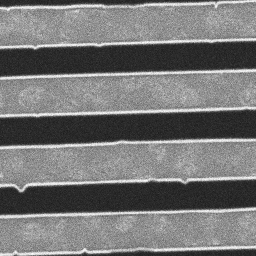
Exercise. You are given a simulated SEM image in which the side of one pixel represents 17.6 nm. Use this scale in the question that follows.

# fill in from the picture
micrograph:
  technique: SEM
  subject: one or a few lines or trenches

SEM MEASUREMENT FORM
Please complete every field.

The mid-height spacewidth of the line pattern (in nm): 660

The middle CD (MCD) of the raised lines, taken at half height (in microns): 0.561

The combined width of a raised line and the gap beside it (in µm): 1.22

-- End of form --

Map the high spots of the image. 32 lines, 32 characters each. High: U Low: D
UUUUUUUUUUUUUUUUUUUUUUDUUDDDDDDD
DDDDDDDDDDDDDDDDDDDDDDDDDDDDDDDD
DDDDDDDDDDDDDDDDDDDDDDDDDDDDDDDD
DDDDDDDDDDDDDDDDDDDDDDDDDDDDDDDD
DDDDDDDDDDDDDDDDDDDDDDDDDDDDDDDD
DDDDDDDDDDDDDDDUUUUUUUUUUUUUUUUU
UUUUUUUUUUUUUUUUUUUUUUUUUUUUUUUU
UUUUUUUUUUUUUUUUUUUUUUUUUUUUUUUU
UUUUUUUUUUUUUUUUUUUUUUUUUUUUUUUU
UUUUUUUDDDDDDDDDDDDDDDDDDDDDDDDD
DDDDDDDDDDDDDDDDDDDDDDDDDDDDDDDD
DDDDDDDDDDDDDDDDDDDDDDDDDDDDDDDD
DDDDDDDDDDDDDDDDDDDDDDDDDDDDDDDD
DDDDDDDDDDDDDDDDDDDDDDDDDDDDDDUD
UUUUUUUUUUUUUUUUUUUUUUUUUUUUUUUU
UUUUUUUUUUUUUUUUUUUUUUUUUUUUUUUU
UUUUUUUUUUUUUUUUUUUUUUUUUUUUUUUU
UUUUUUUUUUUUUUUUUUUUUUUUUUUUUDUU
UDDDDDDDDDDDDDDDDDDDDDDDDDDDDDDD
DDDDDDDDDDDDDDDDDDDDDDDDDDDDDDDD
DDDDDDDDDDDDDDDDDDDDDDDDDDDDDDDD
DDDDDDDDDDDDDDDDDDDDDDDDDDDDDDDD
DDDDDDDDDDDDDDDDDDDUDDDDUUUUUUUU
UUDUUUUUUUUUUUUUUUUUUUUUUUUUUUUU
UUUUUUUUUUUUUUUUUUUUUUUUUUUUUUUU
UUUUUUUUUUUUUUUUUUUUUUUUUUUUUUUU
UUUUUUUUUUUUUUUUUUUDUUDDDDDDDDDD
DDDDDDDDDDDDDDDDDDDDDDDDDDDDDDDD
DDDDDDDDDDDDDDDDDDDDDDDDDDDDDDDD
DDDDDDDDDDDDDDDDDDDDDDDDDDDDDDDD
DDDDDDDDDDDDDDDDDDDDDDDDDDDDDDDD
DDDDDDDDDDUDUUUUUUUUUUUUUUUUUUUU